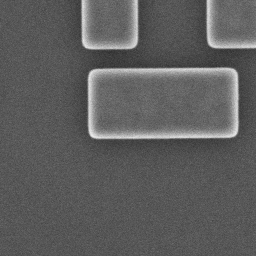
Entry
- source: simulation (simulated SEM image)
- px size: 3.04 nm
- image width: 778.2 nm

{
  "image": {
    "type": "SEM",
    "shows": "wiring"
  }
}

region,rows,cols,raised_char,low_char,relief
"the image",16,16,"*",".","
.....****....***
.....****....***
.....****....***
................
......*********.
......*********.
......*********.
......*********.
......********..
................
................
................
................
................
................
................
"